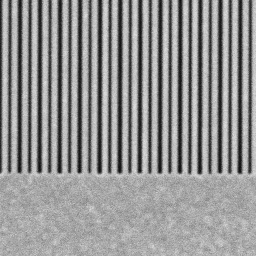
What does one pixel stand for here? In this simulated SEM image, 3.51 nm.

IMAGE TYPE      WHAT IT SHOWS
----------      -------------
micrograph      parallel lines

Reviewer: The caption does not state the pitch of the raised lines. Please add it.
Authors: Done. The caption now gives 10 px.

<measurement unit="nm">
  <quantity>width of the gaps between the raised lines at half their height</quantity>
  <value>10.1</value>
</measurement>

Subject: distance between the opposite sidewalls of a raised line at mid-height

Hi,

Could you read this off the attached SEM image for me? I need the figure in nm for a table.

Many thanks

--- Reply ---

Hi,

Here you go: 23